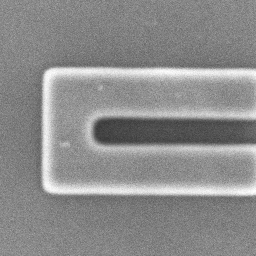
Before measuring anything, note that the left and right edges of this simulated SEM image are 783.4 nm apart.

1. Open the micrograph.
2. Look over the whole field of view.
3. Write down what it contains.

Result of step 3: groups of lines, slits or small figures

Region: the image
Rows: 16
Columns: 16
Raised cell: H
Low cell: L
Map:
LLLLLLLLLLLLLLLL
LLLLLLLLLLLLLLLL
LLLLLLLLLLLLLLLL
LLLLLLLLLLLLLLLL
LLLHHHHHHHHHHHHH
LLLHHHHHHHHHHHHH
LLLHHHHHHHHHHHHH
LLLHHHLLLLLLLLLL
LLLHHHLLLLLLLLLL
LLLHHHHHHHHHHHHH
LLLHHHHHHHHHHHHH
LLLHHHHHHHHHHHHH
LLLLLLLLLLLLLLLL
LLLLLLLLLLLLLLLL
LLLLLLLLLLLLLLLL
LLLLLLLLLLLLLLLL